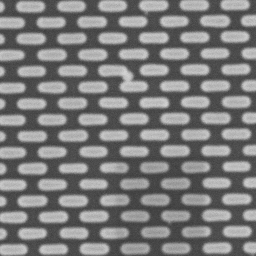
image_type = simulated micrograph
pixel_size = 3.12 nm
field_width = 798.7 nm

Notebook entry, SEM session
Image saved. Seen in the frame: groups of lines, slits or small figures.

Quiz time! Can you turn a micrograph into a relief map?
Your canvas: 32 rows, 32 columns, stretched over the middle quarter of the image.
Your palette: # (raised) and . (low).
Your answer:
.####....######.....######....##
######...#######...#######...###
#####....#######...######.....##
...............##...............
..........................####..
....#######...#######...#######.
....#######...#######...#######.
................................
........................#.....##
######...#######...#######....##
#####....#######...#######....##
................................
................................
....#######...#######...#######.
....######.....######....######.
................................
................................
######...#######...#######....##
######...#######...#######....##
................................
................................
....#######...#######...#######.
....#######...#######...#######.
................................
................................
######...#######...#######....##
######...#######...#######....##
................................
................................
#...#######...#######...#######.
#...#######...#######...#######.
................................